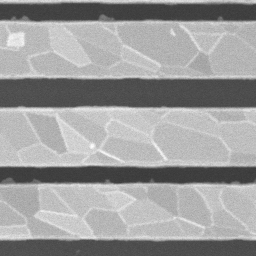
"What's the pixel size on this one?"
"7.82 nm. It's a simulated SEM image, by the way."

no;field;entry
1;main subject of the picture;lines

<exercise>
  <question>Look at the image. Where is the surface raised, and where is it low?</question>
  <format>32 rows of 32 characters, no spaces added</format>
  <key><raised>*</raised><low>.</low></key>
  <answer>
................................
................................
................................
********************************
********************************
********************************
********************************
********************************
********************************
********************************
................................
................................
................................
..*.....*********.******........
********************************
********************************
********************************
********************************
********************************
********************************
********************************
................................
................................
********************************
********************************
********************************
********************************
********************************
********************************
********************************
................................
................................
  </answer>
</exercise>